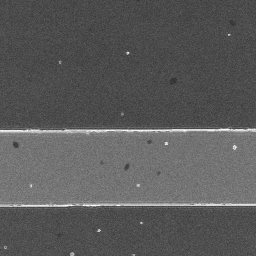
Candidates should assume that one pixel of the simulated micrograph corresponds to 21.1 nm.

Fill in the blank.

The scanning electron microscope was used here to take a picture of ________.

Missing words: lines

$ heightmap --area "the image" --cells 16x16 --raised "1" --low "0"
0000000000000000
0000000000000000
0000000000000000
0000000000000000
0000000000000000
0000000000000000
0000000000000000
0000000000000000
1111111111111111
1111111111111111
1111111111111111
1111111111111111
1111111111111111
0000000000000000
0000000000000000
0000000000000000